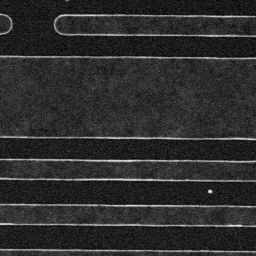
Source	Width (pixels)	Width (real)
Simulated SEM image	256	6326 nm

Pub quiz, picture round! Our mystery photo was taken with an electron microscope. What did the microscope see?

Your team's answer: groups of lines, slits or small figures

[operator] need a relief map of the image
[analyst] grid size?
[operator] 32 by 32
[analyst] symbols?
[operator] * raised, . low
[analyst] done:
................................
................................
*......*************************
*......*************************
..............................**
................................
................................
********************************
********************************
********************************
********************************
********************************
********************************
********************************
********************************
********************************
********************************
................................
................................
................................
********************************
********************************
..................**************
................................
................................
................................
********************************
********************************
................................
................................
................................
****************************....